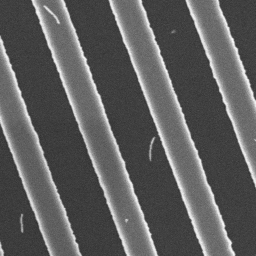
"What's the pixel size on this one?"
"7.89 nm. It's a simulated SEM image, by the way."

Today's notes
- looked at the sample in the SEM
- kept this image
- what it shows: lines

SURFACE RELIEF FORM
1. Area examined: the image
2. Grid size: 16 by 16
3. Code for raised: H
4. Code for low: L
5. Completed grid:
LLHHLLLHHLLLHHLL
LLLHHLLHHLLLHHLL
LLLHHLLLHHLLLHHL
LLLHHLLLHHLLLHHL
HLLLHHLLHHLLLHHL
HLLLHHLLLHHLLLHH
HHLLHHLLLHHLLLHH
HHLLLHHLLLHHLLHH
HHLLLHHLLLHHLLLH
LHHLLLHLLLHHLLLH
LHHLLLHHLLLHHLLL
LHHLLLHHLLLHHLLL
LLHHLLLHHLLHHLLL
LLHHLLLHHLLLHHLL
LLLHHLLHHLLLHHLL
LLLHHLLLHHLLLHHL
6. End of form